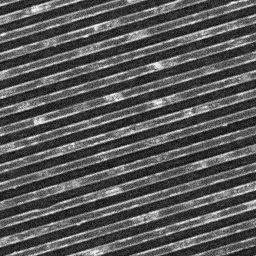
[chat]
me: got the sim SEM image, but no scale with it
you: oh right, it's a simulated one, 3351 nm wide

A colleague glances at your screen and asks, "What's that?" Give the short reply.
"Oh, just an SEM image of parallel lines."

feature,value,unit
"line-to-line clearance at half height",127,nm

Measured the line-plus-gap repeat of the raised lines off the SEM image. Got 0.233 microns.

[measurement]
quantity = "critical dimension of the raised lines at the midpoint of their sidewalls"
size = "0.103 microns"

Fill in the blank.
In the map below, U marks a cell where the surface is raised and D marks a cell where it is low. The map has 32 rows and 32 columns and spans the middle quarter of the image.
DDDDUUUUUUUUDDDDDDDDUUUUUUUDDDDD
DDUUUUUUDDDDDDDDDUUUUUUUDDDDDDDD
UUUUDDDDDDDDDDUUUUUUUDDDDDDDDUUU
UDDDDDDDDDUUUUUUUDDDDDDDDDUUUUUU
DDDDDDDUUUUUUUDDDDDDDDUUUUUUUDDD
DDDDUUUUUUDDDDDDDDDUUUUUUUDDDDDD
UUUUUUUDDDDDDDDDUUUUUUDDDDDDDDDU
UUUUDDDDDDDDUUUUUUUDDDDDDDDDUUUU
DDDDDDDDDUUUUUUUDDDDDDDDUUUUUUUD
DDDDDDUUUUUUDDDDDDDDDUUUUUUUDDDD
DDUUUUUUUDDDDDDDDDUUUUUUUDDDDDDD
UUUUUUDDDDDDDDUUUUUUUDDDDDDDDDUU
UUDDDDDDDDDUUUUUUUDDDDDDDDDUUUUU
DDDDDDDUUUUUUUDDDDDDDDDDUUUUUUDD
DDDDUUUUUUUDDDDDDDDDUUUUUUUDDDDD
DUUUUUUUDDDDDDDDDUUUUUUDDDDDDDDD
UUUUDDDDDDDDDDUUUUUUDDDDDDDDDUUU
UDDDDDDDDDUUUUUUUDDDDDDDDDUUUUUU
DDDDDDDUUUUUUUDDDDDDDDUUUUUUUDDD
DDDUUUUUUUDDDDDDDDDUUUUUUUDDDDDD
UUUUUUUDDDDDDDDUUUUUUUDDDDDDDDDU
UUUUDDDDDDDDUUUUUUUDDDDDDDDDUUUU
DDDDDDDDDUUUUUUUDDDDDDDDUUUUUUUD
DDDDDUUUUUUUDDDDDDDDDUUUUUUUDDDD
DDUUUUUUUDDDDDDDDUUUUUUUDDDDDDDD
UUUUUUDDDDDDDDUUUUUUUDDDDDDDDDUU
UUDDDDDDDDDUUUUUUUDDDDDDDDUUUUUU
DDDDDDDUUUUUUUDDDDDDDDDUUUUUUUDD
DDDDUUUUUUUDDDDDDDDUUUUUUUDDDDDD
DUUUUUUDDDDDDDDDUUUUUUUDDDDDDDDD
UUUUDDDDDDDDDUUUUUUDDDDDDDDDDUUU
UDDDDDDDDDUUUUUUDDDDDDDDDUUUUUUU